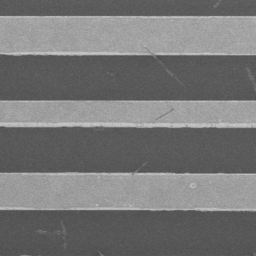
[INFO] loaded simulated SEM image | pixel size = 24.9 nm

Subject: lines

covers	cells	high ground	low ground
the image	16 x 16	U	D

DDDDDDDDDDDDDDDD
UUUUUUUUUUUUUUUU
UUUUUUUUUUUUUUUU
DDDDDDDDDDDDDDDD
DDDDDDDDDDDDDDDD
DDDDDDDDDDDDDDDD
UUUUUUUUUUUUUUUU
UUUUUUUUUUUUUUUU
DDDDDDDDDDDDDDDD
DDDDDDDDDDDDDDDD
DDDDDDDDDDDDDDDD
UUUUUUUUUUUUUUUU
UUUUUUUUUUUUUUUU
DDDDDDDDDDDDDDDD
DDDDDDDDDDDDDDDD
DDDDDDDDDDDDDDDD